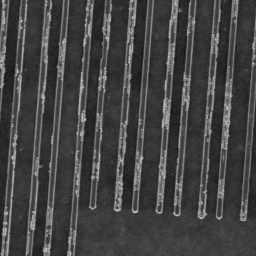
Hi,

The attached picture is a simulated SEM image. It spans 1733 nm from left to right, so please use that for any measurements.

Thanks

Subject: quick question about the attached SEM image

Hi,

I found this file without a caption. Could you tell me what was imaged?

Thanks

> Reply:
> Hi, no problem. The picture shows parallel lines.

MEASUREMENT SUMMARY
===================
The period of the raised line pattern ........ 0.144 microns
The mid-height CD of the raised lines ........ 38.8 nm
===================